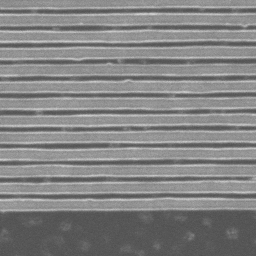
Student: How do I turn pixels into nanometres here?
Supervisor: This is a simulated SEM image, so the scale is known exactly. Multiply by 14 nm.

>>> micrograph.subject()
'parallel lines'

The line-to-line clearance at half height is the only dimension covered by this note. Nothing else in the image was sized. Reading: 128 nm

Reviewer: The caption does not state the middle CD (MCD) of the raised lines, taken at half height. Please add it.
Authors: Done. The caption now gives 0.103 micrometres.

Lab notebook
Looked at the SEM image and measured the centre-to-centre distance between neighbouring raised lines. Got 16.8 pixels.